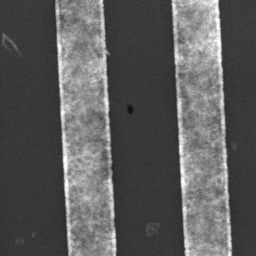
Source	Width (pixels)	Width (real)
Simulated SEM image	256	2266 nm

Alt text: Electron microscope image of one or a few lines or trenches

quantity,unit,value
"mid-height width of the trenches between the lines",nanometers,634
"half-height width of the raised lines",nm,389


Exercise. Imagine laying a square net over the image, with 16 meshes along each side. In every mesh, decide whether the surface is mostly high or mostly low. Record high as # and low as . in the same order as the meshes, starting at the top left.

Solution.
....##.....###..
....##.....###..
....##.....###..
....###....###..
....###....###..
....###....###..
....###....###..
....###....###..
....###....###..
....###....###..
....###....###..
....###....###..
....###....###..
....###.....##..
....###.....##..
....###.....##..